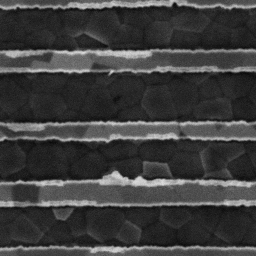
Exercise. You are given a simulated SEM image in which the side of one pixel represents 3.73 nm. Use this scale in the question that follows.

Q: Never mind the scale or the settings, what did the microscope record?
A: one or a few lines or trenches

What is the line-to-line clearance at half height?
0.164 um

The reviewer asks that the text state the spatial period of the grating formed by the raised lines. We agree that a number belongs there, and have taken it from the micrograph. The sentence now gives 246 nanometres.